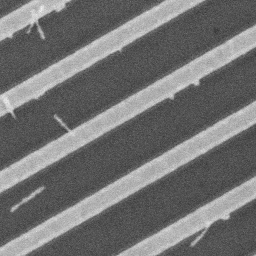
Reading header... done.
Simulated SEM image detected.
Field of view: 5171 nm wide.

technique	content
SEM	lines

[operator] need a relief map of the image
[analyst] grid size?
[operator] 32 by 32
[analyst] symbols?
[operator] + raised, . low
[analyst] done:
...+++++............+++++.......
..++++............+++++.........
+++++...........+++++...........
+++............++++............+
+............+++++............++
...........+++++............++++
.........+++++............+++++.
........++++............+++++...
......+++++............++++.....
....+++++............+++++......
...++++............+++++........
.++++............+++++..........
++++............++++............
++............+++++............+
............+++++............+++
..........+++++............+++++
.........++++............+++++..
.......++++.............++++....
.....+++++............++++......
...+++++............+++++.......
..++++............+++++.........
++++.............++++...........
+++............+++++...........+
+............+++++...........+++
...........+++++............++++
..........++++............+++++.
........+++++...........+++++...
......+++++...........+++++.....
....+++++............++++.......
...++++............+++++........
.++++............+++++..........
++++...........+++++............